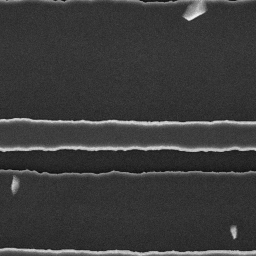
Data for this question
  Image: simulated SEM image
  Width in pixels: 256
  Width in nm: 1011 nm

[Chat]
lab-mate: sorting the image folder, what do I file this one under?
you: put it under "lines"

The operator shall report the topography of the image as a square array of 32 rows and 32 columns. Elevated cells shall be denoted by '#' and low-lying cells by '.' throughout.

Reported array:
................................
................................
................................
................................
................................
................................
................................
................................
................................
................................
................................
................................
................................
................................
................................
################################
################################
################################
################################
................................
................................
................................
................................
................................
................................
................................
................................
................................
................................
................................
................................
#################..#.###########